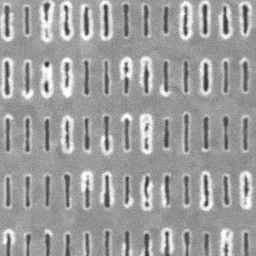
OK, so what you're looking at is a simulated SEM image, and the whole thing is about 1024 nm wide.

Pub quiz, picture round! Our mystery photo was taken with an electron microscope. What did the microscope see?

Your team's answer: a regular array of holes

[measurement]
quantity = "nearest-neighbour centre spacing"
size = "78.9 nm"